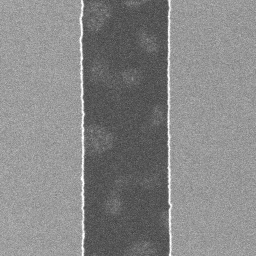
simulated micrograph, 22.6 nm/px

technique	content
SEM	one or a few lines or trenches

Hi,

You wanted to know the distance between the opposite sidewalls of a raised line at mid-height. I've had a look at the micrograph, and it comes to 1.97 microns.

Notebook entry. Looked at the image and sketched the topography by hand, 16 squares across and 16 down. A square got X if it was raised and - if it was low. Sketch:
-----XXXXXX-----
-----XXXXXX-----
-----XXXXXX-----
-----XXXXXX-----
-----XXXXXX-----
-----XXXXXX-----
-----XXXXXX-----
-----XXXXXX-----
-----XXXXXX-----
-----XXXXXX-----
-----XXXXXX-----
-----XXXXXX-----
-----XXXXXX-----
-----XXXXXX-----
-----XXXXXX-----
-----XXXXXX-----